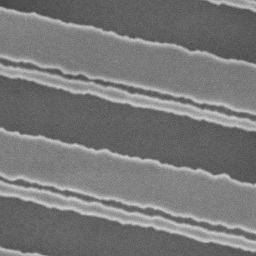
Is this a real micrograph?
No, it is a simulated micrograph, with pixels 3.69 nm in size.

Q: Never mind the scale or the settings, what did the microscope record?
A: lines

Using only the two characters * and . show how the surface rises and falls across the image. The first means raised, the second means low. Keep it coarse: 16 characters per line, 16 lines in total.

...............*
****............
*********.......
*************...
****************
....************
........********
.............***
**..............
*******.........
************....
****************
..**************
......**********
...........*****
...............*